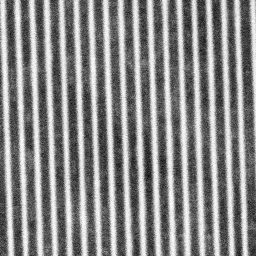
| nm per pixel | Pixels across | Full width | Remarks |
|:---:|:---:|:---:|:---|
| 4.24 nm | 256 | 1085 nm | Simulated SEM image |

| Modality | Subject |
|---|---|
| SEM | parallel lines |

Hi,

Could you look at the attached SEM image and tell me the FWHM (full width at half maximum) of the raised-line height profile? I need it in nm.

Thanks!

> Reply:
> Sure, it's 20.1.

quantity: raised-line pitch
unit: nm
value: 62.1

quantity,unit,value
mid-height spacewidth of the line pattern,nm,44